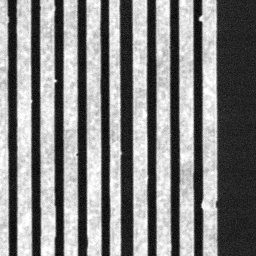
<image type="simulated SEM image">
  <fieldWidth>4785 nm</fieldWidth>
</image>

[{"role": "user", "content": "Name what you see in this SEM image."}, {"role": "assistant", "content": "parallel lines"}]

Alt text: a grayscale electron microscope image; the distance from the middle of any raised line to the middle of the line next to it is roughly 0.433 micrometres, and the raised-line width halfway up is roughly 0.236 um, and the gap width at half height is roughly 189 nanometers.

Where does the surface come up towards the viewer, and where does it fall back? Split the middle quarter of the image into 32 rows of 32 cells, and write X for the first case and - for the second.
XXX---XXX---XX----XX---XXX---XXX
XXX---XXX---XX----XX---XXX---XXX
XXX---XXX---XX----XX---XXX---XXX
XXX---XXX---XX----XX---XXX---XXX
XXX---XXX---XX----XX---XXX---XXX
XXX---XXX---XX----XX---XXX---XXX
XXX---XXX---XX----XX---XXX---XXX
XXX---XXX---XX----XX---XXX---XXX
XXX---XXX---XX----XXX--XXX---XXX
XXX---XXX---XX----XXX--XXX---XXX
XXX---XXX---XX----XXX--XXX---XXX
XXX---XXX---XX----XXX--XXX---XXX
XXX---XXX---XX----XXX--XXX---XXX
XXX---XXX---XX----XXX--XXX---XXX
XXX---XXX---XX----XXX--XXX---XXX
XXX---XXX---XX----XXX--XXX---XXX
XXX---XXX---XX----XXX--XXX---XXX
XXX---XXX---XX----XXX--XXX---XXX
XXX---XXX---XX----XXX--XXX---XXX
XXX---XXX---XX----XXX--XXX---XXX
XXX---XXX---XX----XXX--XXX---XXX
XXX---XXX---XX----XXX--XXX---XXX
XXX---XXX---XX----XXX--XXX---XXX
XXX---XXX---XX----XXX--XXX---XXX
XXX---XXX---XX----XXX--XXX---XXX
XXX---XXX---XX----XXX--XXX---XXX
XXX---XXX---XX----XXX--XXX---XXX
XXX---XXX---XX----XXX--XXX---XXX
XXX---XXX---XX----XXX--XXX---XXX
XXX---XXX---XX----XXX--XXX---XXX
XXX---XXX---XX----XXX--XXX---XXX
XXX---XXX---XX----XXX--XXX---XXX